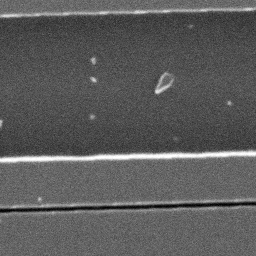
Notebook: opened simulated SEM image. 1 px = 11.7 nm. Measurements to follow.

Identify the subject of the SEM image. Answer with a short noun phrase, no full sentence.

lines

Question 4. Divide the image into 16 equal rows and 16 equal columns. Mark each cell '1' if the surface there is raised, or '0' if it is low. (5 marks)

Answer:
1111111111111111
0000000000000000
0000000000000000
0000000000000000
0000000000000000
0000000000000000
0000000000000000
0000000000000000
0000000000000000
0000000000000000
1111111111111111
1111111111111111
1111111111111111
1111111111111111
1111111111111111
1111111111111111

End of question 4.